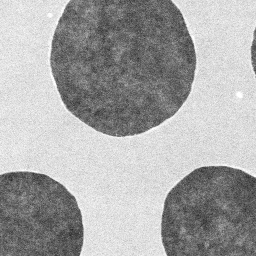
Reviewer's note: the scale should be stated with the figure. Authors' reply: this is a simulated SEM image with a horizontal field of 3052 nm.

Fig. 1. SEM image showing holes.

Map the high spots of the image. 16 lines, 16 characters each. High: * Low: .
****.......*****
****........****
***.........****
***.........****
***.........****
****........****
****.......*****
*****.....******
*******.********
****************
************...*
....*******.....
.....*****......
.....*****......
.....*****......
.....*****......